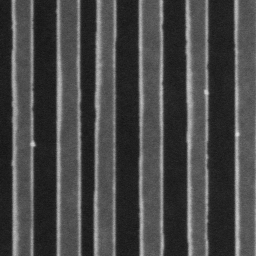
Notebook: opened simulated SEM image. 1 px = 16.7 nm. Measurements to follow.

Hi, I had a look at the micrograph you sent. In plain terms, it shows lines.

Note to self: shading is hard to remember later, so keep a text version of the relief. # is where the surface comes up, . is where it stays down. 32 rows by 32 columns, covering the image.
..##...###..##....##...###...###
..##...###..##....##...###...###
..##...###..##....##...###...###
..##...###..##....##...###...###
..##...###..##....##...###...###
..##...###..##....##...###...###
..##...###..##....##...###...###
..##...###..##....##...###...###
..##...###..##....##...###...###
..##...###..##....##...###...###
..##...###..##....##...###...###
..##...###..##....##...###....##
..##...###..##....##....##....##
..##...###..##....##....##....##
..##...###..##....##....##....##
..##...###..##....##....##....##
..##...###..##....##....##...###
..##...###..##....##...###....##
..##...###..##....##...###....##
..##...###..##....##...###....##
..##...###..##....##...###....##
..##...###..##....##...###....##
..##...###..##....##...###....##
..##...###..##....##....##....##
..##...###..##....##....##....##
..##...###..##....##....##....##
..##...###..##....##....##....##
..##...###..##....##....##....##
..##...###..##....##....##....##
..##...###..##....##....##....##
..##...###..##....##....##....##
..##...###..##....##....##....##